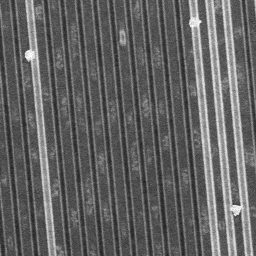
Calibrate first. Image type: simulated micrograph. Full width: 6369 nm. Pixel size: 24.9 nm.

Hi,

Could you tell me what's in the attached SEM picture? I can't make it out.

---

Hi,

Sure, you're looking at parallel lines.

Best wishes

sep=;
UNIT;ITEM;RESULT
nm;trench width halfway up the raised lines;254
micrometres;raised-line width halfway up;0.149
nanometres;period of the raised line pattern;406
